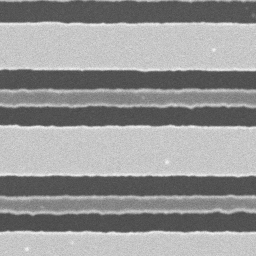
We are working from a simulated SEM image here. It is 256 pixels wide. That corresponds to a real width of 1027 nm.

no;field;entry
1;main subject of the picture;lines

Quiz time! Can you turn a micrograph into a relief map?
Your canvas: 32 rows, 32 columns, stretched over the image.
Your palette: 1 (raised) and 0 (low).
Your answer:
00000000000000000000000000000000
00000000000000000000000000000000
00000000000000000000000000000000
11111111111111111111111111111111
11111111111111111111111111111111
11111111111111111111111111111111
11111111111111111111111111111111
11111111111111111111111111111111
11111111111111111111111111111111
00000000000000000000000000000000
00000000000000000000000000000000
11111111111111111111111111111111
11111111111111111111111111111111
00000000000000000000000100000000
00000000000000000000000000000000
00000000000000000000000000000000
11111111111111111111111111111111
11111111111111111111111111111111
11111111111111111111111111111111
11111111111111111111111111111111
11111111111111111111111111111111
11111111111111111111111111111111
00000000000000000000000000000000
00000000000000000000000000000000
00000000000000000000000010001100
11111111111111111111111111111111
11111111111111111111111111111111
00000000000000000000000000000000
00000000000000000000000000000000
11111111111111111111111111111111
11111111111111111111111111111111
11111111111111111111111111111111